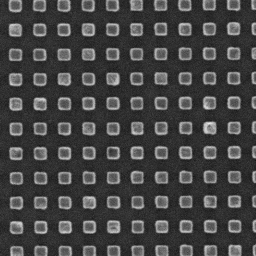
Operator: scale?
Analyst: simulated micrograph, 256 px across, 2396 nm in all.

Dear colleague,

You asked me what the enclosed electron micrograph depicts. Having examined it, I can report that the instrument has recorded a regular array of raised bodies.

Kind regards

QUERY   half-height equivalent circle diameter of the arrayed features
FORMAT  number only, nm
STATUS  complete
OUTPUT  126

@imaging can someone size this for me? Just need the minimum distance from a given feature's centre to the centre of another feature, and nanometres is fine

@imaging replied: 225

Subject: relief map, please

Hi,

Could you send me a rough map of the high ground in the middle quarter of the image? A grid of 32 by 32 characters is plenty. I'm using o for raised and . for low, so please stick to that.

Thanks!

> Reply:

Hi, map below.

................................
................................
o....oo....oo....oo....ooo...ooo
oo...ooo...ooo...ooo...ooo...ooo
oo...ooo...ooo...ooo...ooo...ooo
................................
................................
................................
o....oo....oo....oo....oo....oo.
oo...ooo...ooo...ooo...ooo...ooo
oo...ooo...ooo...ooo...ooo...ooo
................................
................................
................................
................................
oo...ooo...ooo...ooo...ooo...ooo
oo...ooo...ooo...ooo...ooo...ooo
................................
................................
................................
................................
oo...ooo...ooo...ooo...ooo...ooo
oo...ooo...ooo...ooo...ooo...ooo
oo...ooo...ooo...oo....ooo...ooo
................................
................................
................................
oo...ooo...ooo...ooo...ooo...ooo
oo...ooo...ooo...ooo...ooo...ooo
oo...ooo...ooo...ooo...ooo...ooo
................................
................................